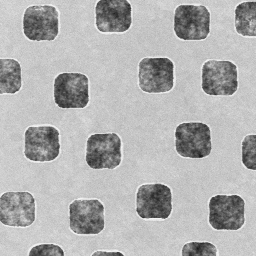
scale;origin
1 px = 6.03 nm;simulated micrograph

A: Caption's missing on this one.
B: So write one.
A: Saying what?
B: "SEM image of a regular array of holes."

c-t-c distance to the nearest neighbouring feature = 381 nm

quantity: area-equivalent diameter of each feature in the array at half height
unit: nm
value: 233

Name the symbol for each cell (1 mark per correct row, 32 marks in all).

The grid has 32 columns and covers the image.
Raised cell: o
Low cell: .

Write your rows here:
oooooooooooo....oooooooooooooo..
ooo....ooooo.....ooooo....ooo...
ooo....ooooo.....ooooo....ooo...
ooo....ooooo....oooooo....ooo...
ooo....ooooooooooooooo....ooooo.
oooooooooooooooooooooooooooooooo
oooooooooooooooooooooooooooooooo
..oooooooooooooooo...ooooo.ooooo
...oooooooooooooo.....ooo.....oo
...oooo....oooooo.....ooo.....oo
...oooo....oooooo.....ooo.....oo
..ooooo....ooooooo...oooo....ooo
ooooooo....ooooooooooooooooooooo
oooooooo..oooooooooooooooooooooo
oooooooooooooooooooooooooooooooo
ooooooooooooooooooooooo...oooooo
ooo....ooooooooooooooo....oooooo
ooo.....ooo....ooooooo....oooo..
ooo....oooo....ooooooo....oooo..
ooo....oooo....oooooooo...oooo..
ooooooooooo....ooooooooooooooo..
oooooooooooooooooooooooooooooooo
oooooooooooooooooooooooooooooooo
ooooooooooooooooo....ooooooooooo
....ooooooooooooo....oooooo...oo
....ooooo....oooo....ooooo.....o
....ooooo....oooo....ooooo.....o
....ooooo....oooooo.oooooo.....o
ooooooooo....oooooooooooooo...oo
oooooooooooooooooooooooooooooooo
ooooo..oooooooooooooooo...oooooo
oooo....oooo...oooooooo....ooooo